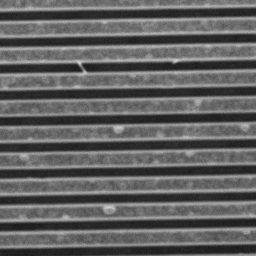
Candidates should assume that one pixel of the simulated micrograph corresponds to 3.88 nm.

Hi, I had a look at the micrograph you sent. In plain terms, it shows parallel lines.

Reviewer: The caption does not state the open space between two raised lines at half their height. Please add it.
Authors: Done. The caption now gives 10.9 pixels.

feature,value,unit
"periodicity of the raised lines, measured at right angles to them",102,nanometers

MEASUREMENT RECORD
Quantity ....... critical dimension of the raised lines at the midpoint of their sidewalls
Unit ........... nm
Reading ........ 60.6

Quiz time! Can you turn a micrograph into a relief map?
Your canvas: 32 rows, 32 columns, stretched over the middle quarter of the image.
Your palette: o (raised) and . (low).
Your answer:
................................
................................
oooooooooooooooooooooooooooooooo
oooooooooooooooooooooooooooooooo
oooooooooooooooooooooooooooooooo
oooooooooooooooooooooooooooooooo
................................
................................
............................oooo
oooooooooooooooooooooooooooooooo
oooooooooooooooooooooooooooooooo
oooooooooooooooooooooooooooooooo
ooooooo.........oooo............
................................
................................
......oooooooooooooooooooooooooo
oooooooooooooooooooooooooooooooo
oooooooooooooooooooooooooooooooo
oooooooooooooooooooooooooooooooo
................................
................................
................................
oooooooooooooooooooooooooooooooo
oooooooooooooooooooooooooooooooo
oooooooooooooooooooooooooooooooo
oooooooooooooooooooooo..........
................................
................................
........oooooooooooooooooooooooo
oooooooooooooooooooooooooooooooo
oooooooooooooooooooooooooooooooo
oooooooooooooooooooooooooooooooo